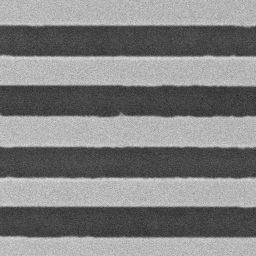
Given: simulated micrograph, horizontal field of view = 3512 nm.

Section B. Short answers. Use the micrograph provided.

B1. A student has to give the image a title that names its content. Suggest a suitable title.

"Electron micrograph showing lines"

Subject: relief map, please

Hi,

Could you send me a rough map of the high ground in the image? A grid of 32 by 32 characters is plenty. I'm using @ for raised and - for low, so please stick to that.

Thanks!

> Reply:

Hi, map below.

@@@@@@@@@@@@@@@@@@@@@@@@@@@@@@@@
@@@@@@@@@@@@@@@@@@@@@@@@@@@@@@@@
@@@@@@@@@@@@@@@@@@@@@@@@@@@@@@@@
--------------------------------
--------------------------------
--------------------------------
--------------------------------
@@@@@@@@@@@@@@@@@@@@@@@@@@@@@@@@
@@@@@@@@@@@@@@@@@@@@@@@@@@@@@@@@
@@@@@@@@@@@@@@@@@@@@@@@@@@@@@@@@
@@@@@@@@@@@@@@@@@@@@@@@@@@@@@@@@
--------------------------------
--------------------------------
--------------------------------
--@-----------------------------
@@@@@@@@@@@@@@@@@@@@@@@@@@@@@@@@
@@@@@@@@@@@@@@@@@@@@@@@@@@@@@@@@
@@@@@@@@@@@@@@@@@@@@@@@@@@@@@@@@
--------------------------------
--------------------------------
--------------------------------
--------------------------------
@@@@@@@@@@@@@@@@@@@@@@@@@@@@@@@@
@@@@@@@@@@@@@@@@@@@@@@@@@@@@@@@@
@@@@@@@@@@@@@@@@@@@@@@@@@@@@@@@@
@@@@@@@@@@@@@@@@@@@@@@@@@@@@@@@@
--------------------------------
--------------------------------
--------------------------------
--------------------------------
@@@@@@@@@@@@@@@@@@@@@@@@@@@@@@@@
@@@@@@@@@@@@@@@@@@@@@@@@@@@@@@@@